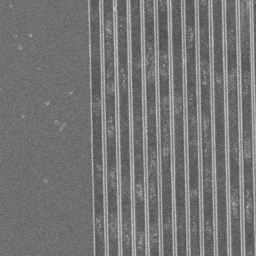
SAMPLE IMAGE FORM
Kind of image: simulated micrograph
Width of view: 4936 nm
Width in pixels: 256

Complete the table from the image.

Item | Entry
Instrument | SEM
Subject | parallel lines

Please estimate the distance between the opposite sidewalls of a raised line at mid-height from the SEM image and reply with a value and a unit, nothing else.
55.4 nm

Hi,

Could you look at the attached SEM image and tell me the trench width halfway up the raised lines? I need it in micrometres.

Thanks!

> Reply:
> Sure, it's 0.202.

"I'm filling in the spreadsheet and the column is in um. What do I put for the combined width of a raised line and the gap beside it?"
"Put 0.263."